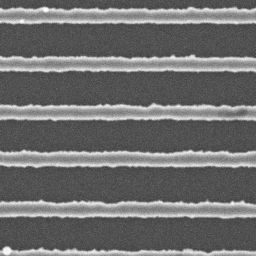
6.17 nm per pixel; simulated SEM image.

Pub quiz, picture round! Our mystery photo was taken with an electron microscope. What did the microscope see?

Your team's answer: lines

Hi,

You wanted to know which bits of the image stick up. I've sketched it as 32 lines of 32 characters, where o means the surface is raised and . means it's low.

................................
oooooooooooooooooooooooooooooooo
oooooooooooooooooooooooooooooooo
................................
................................
................................
................................
oooooooooooooooooooooooooooooooo
oooooooooooooooooooooooooooooooo
................................
................................
................................
................................
oooooooooooooooooooooooooooooooo
oooooooooooooooooooooooooooooooo
................................
................................
................................
................................
oooooooooooooooooooooooooooooooo
oooooooooooooooooooooooooooooooo
................................
................................
................................
................................
ooooooooooooooooooooooooooooooo.
oooooooooooooooooooooooooooooooo
................................
................................
................................
................................
oooooooooooooooo.oooooooo..ooooo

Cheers